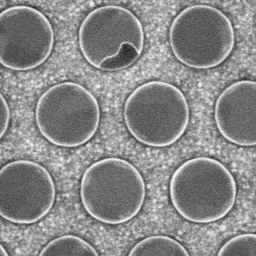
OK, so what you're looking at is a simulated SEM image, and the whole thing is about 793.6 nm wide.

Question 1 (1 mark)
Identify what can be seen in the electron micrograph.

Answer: raised bodies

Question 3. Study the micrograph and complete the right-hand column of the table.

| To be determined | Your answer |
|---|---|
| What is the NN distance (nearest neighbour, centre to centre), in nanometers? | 276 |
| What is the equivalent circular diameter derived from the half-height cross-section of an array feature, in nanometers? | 196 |